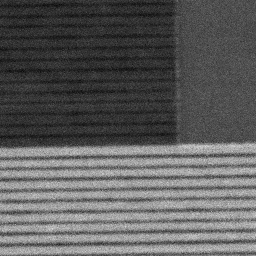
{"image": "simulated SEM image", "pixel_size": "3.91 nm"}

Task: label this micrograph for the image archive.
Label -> parallel lines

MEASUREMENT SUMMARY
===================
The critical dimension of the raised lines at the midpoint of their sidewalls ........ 7.62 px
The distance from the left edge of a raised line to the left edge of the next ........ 42.6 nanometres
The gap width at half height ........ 13.2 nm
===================